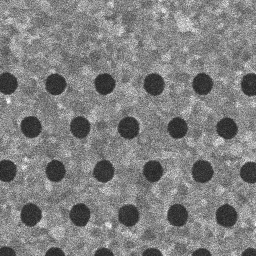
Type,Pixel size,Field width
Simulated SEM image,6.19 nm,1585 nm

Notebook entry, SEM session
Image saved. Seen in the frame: a regular array of holes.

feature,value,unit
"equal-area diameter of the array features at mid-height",138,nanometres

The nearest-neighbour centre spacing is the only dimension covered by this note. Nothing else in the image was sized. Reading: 302 nanometres